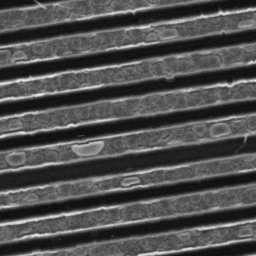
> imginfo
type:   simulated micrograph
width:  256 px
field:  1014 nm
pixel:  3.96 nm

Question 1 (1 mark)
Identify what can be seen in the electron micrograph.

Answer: parallel lines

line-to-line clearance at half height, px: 13.1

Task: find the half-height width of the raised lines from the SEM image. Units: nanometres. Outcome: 85.3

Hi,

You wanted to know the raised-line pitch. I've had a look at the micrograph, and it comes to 138 nanometers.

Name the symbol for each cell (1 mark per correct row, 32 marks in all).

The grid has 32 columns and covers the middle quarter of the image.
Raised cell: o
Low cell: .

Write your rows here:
..........oooooooooooooooooooooo
...ooooooooooooooooooooooooooooo
oooooooooooooooooooooooooooooooo
oooooooooooooooooooooooo..o.....
ooooooooooooooooo...............
oooooooooo......................
ooooo.......................oooo
.....................ooooooooooo
...............ooooooooooooooooo
........oooooooooooooooooooooooo
..oooooooooooooooooooooooooooooo
oooooooooooooooooooooooooooooo..
ooooooooooooooooooooooo.........
ooooooooooooooooo...............
oooooooooo......................
oooo.......................ooooo
....................oooooooooooo
..............oooooooooooooooooo
........oooooooooooooooooooooooo
o.oooooooooooooooooooooooooooooo
oooooooooooooooooooooooooooo....
oooooooooooooooooooooo..........
ooooooooooooooo.................
ooooooooo.......................
oo..............................
............................oooo
.....................ooooooooooo
................oooooooooooooooo
........oooooooooooooooooooooooo
.ooooooooooooooooooooooooooo....
oooooooooooooooooooooo..........
oooooooooooooooo................